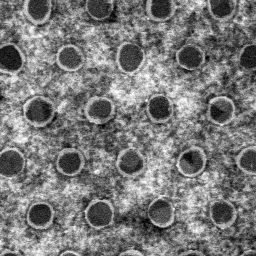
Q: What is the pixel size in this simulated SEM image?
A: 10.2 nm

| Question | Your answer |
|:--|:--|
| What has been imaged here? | a regular array of raised bodies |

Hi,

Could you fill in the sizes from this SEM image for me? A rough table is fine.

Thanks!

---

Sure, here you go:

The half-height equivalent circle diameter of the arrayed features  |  266 nanometers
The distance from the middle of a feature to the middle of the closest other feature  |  603 nanometers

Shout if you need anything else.